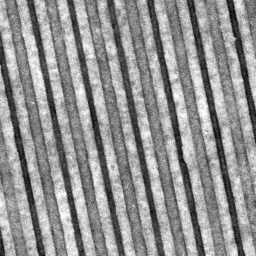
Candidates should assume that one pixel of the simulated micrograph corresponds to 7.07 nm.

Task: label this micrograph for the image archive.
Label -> parallel lines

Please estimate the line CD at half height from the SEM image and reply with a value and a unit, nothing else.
71 nm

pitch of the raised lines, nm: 138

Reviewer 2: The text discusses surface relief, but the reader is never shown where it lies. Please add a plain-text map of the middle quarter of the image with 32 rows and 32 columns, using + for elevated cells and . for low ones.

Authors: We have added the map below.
.+++..++...+++..++...+++..++...+
..++..++....++..+++...++..++....
..++..+++...++..+++...++..+++...
..+++.+++...++..+++...++..+++...
..+++.+++...+++..++...+++..++...
..+++..++...+++..++...+++..++...
...++..++....++..++....++..++...
...++..+++...++..+++...++..+++..
...+++.+++...+++.+++...++..+++..
...+++..++...+++..++...+++..++..
....++..++...+++..++....++..++..
+...++..++....++..++....++..++..
+...++..+++...++..+++...++..+++.
+...+++.+++...+++.+++...++..+++.
+...+++..++....++..++...+++..++.
+....++..++....++..++....++..++.
++...++..+++...++..++....++..++.
++...++..+++...++..+++...++..+++
++...+++.+++...+++.+++...++..+++
++...+++..++...+++..++...+++..++
++....++..++...+++..++....++..++
+++...++..+++...++..++....++..++
+++...++..+++...++..+++...++..++
.++...+++.+++...+++.+++...++..++
.++...+++..++...+++..++...+++.++
.++....++..++...+++..++....++..+
.+++...++..+++...++..++....++..+
.+++...++..+++...++..+++...++..+
..++...+++.+++...+++.+++...+++.+
..++...+++..++....++..++...+++..
..++....++..++....++..++...+++..
..+++...++..+++...++..+++...++..